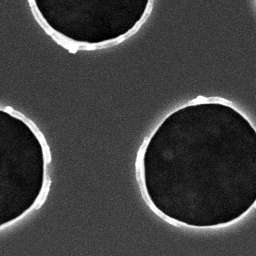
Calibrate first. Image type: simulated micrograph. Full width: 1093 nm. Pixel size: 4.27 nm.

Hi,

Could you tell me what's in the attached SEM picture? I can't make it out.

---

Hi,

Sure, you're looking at holes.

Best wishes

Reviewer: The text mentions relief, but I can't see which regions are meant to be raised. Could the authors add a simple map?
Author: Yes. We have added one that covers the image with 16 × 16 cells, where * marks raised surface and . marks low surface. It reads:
**.......*******
***.....********
****...*********
****************
****************
****************
*************.**
.*********.....*
..********......
...******.......
...******.......
...******.......
..*******.......
.*********.....*
****************
****************